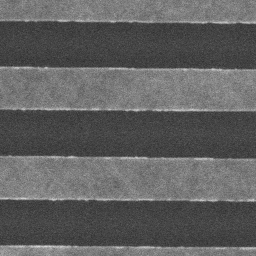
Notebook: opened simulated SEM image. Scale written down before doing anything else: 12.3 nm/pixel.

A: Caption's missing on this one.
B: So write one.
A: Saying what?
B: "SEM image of lines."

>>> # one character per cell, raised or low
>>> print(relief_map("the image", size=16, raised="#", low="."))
################
................
................
................
################
################
################
................
................
................
################
################
...........#####
................
................
##########.#....